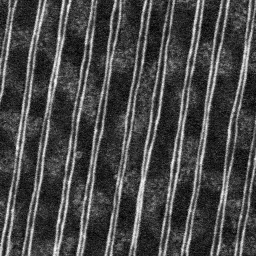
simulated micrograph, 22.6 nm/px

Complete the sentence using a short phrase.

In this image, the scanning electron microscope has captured parallel lines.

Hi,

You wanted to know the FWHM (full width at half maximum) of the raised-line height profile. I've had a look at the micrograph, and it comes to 117 nanometers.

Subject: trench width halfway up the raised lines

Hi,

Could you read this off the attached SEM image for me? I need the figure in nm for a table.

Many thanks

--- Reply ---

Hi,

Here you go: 471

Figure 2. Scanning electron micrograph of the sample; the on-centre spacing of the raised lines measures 589 nanometres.